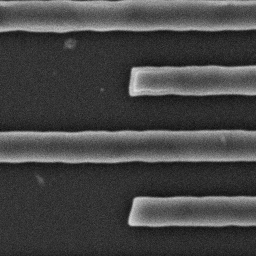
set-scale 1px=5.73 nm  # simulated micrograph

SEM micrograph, wiring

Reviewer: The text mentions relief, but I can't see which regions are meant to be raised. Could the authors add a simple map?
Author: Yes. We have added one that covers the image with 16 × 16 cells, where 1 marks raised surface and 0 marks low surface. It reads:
1111111111111111
1111111111111111
0000000000000000
0000000000000000
0000000011111111
0000000011111111
0000000000000000
0000000000000000
1111111111111111
1111111111111111
0000000000000000
0000000000000000
0000000001111111
0000000011111111
0000000000000000
0000000000000000